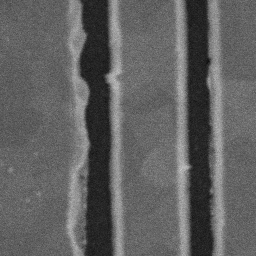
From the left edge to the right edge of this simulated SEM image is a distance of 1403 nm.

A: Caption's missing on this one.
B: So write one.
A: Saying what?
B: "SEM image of one or a few lines or trenches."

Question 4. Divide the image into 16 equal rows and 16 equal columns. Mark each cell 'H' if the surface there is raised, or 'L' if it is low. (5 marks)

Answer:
HHHHHLLHHHHLLHHH
HHHHHLLHHHHLLHHH
HHHHHLLHHHHLLHHH
HHHHHLLHHHHLLHHH
HHHHHLLHHHHLLHHH
HHHHHLLHHHHLLLHH
HHHHHLLHHHHLLLHH
HHHHHLLHHHHLLLHH
HHHHHLLHHHHLLLHH
HHHHHLLHHHHLLLHH
HHHHHLLHHHHLLLHH
HHHHHLLHHHHLLLHH
HHHHHLLHHHHLLLHH
HHHHHLLHHHHLLLHH
HHHHLLLHHHHLLLHH
HHHHHLLHHHHLLLHH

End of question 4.